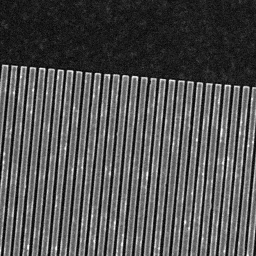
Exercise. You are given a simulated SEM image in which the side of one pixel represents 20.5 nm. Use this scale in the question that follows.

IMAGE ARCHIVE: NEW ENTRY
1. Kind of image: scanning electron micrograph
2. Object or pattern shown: parallel lines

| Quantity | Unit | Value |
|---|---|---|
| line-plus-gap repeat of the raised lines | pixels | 9.3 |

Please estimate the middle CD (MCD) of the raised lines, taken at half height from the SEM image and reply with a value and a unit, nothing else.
112 nanometers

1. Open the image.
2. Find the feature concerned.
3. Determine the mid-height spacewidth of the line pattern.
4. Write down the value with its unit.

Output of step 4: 76.6 nm